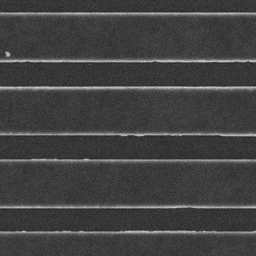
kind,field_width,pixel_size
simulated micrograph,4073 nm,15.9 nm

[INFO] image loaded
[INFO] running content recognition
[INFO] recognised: lines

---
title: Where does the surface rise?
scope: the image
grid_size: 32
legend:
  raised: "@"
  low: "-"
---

--------------------------------
--------------------------------
@@@@@@@@@@@@@@@@@@@@@@@@@@@@@@@@
@@@@@@@@@@@@@@@@@@@@@@@@@@@@@@@@
@@@@@@@@@@@@@@@@@@@@@@@@@@@@@@@@
@@@@@@@@@@@@@@@@@@@@@@@@@@@@@@@@
@@@@@@@@@@@@@@@@@@@@@@@@@@@@@@@@
@@@@@@@@@@@@@@@@@@@@@@@@@@@@@@@@
--------------------------------
--------------------------------
--------------------------------
@@@@@@@@@@@@@@@@@@@@@@@@@@@@@@@@
@@@@@@@@@@@@@@@@@@@@@@@@@@@@@@@@
@@@@@@@@@@@@@@@@@@@@@@@@@@@@@@@@
@@@@@@@@@@@@@@@@@@@@@@@@@@@@@@@@
@@@@@@@@@@@@@@@@@@@@@@@@@@@@@@@@
@@@@@@@@@@@@@@@@@@@@@@@@@@@@@@@@
--------------------------------
--------------------------------
--------------------------------
@@@@@@@@@@@@@@@@@@@@@@@@@@@@@@@@
@@@@@@@@@@@@@@@@@@@@@@@@@@@@@@@@
@@@@@@@@@@@@@@@@@@@@@@@@@@@@@@@@
@@@@@@@@@@@@@@@@@@@@@@@@@@@@@@@@
@@@@@@@@@@@@@@@@@@@@@@@@@@@@@@@@
@@@@@@@@@@@@@@@@@@@@@@@@@@@@@@@@
--------------------------------
--------------------------------
--------------------------------
@@@@@@@@@@@@@@@@@@@@@@@@@@@@@@@@
@@@@@@@@@@@@@@@@@@@@@@@@@@@@@@@@
@@@@@@@@@@@@@@@@@@@@@@@@@@@@@@@@